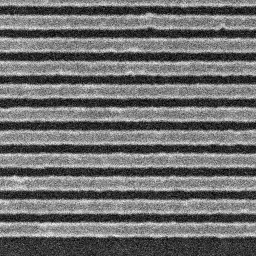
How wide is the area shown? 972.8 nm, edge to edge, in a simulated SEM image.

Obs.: parallel lines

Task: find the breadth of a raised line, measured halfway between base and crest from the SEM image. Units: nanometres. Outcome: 44.1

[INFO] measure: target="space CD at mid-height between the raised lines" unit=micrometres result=0.0403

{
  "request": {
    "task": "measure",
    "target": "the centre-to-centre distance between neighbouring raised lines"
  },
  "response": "0.0876 microns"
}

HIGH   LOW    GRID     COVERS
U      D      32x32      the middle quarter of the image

UUUUUUUUUUUUUUUUUUUUUUUUUUUUUUUU
UUUUUUUUUUUUUUUUUUUUUUUUUUUUUUUU
DUUUUUUUUUUDUUDDDUDDDDUDUUUUUDUD
DDDDDDDDDDDDDDDDDDDDDDDDDDDDDDDD
DDDDDDDDDDDDDDDDDDDDDDDDDDDDDDDD
UUUUUUUUUUUUUUUUUUUUUDUUUUUUUUUD
UUUUUUUUUUUUUUUUUUUUUUUUUUUUUUUU
UUUUUUUUUUUUUUUUUUUUUUUUUUUUUUUU
DDDDDDDDDDDDDDDDDDDDDDDDDDDDDDDD
DDDDDDDDDDDDDDDDDDDDDDDDDDDDDDDD
DDDDDDDDDDDDDDDDDDDDDDDDDDDDDDDD
UUUUUUUUUUUUUUUUUUUUUUUUUUUUUUUU
UUUUUUUUUUUUDDUUUUUUUUUUUUUUUUUU
UUUUUUUUUUUUUUUUUUUUUUUUUUUUUUUU
DDDDDDDDDDDDDDDDDDDDDDDDDDDDDDDD
DDDDDDDDDDDDDDDDDDDDDDDDDDDDDDDD
DDDDDDDDDDDDDDDDDDDDDDDDDDDDDDDD
UUUUUUUUUUUUUUUUUUUUUUUUUUUUUUUU
UUUUUUUUUUUUUUUUUUUUUUUUUUUUUUUU
UUUUUUUUUUUUUUUUUUUUUUUUUUUUUUUU
DDDDDDDDDDDDDDDDDDDDDDDDDDDDDDDD
DDDDDDDDDDDDDDDDDDDDDDDDDDDDDDDD
DDDDDDDDDDDDDDDDDDDDDDDDDDDDDDDD
UUUUUUUUUUUUUUUUUUUUUUUUUUUUUUUU
UUUUUUUUUUUUUUUUUUUUUUUUUUUUUUUU
UUUUUUUUUUUUUUUUUUUUUUUUUUUUUUUU
DDDDDDDDDDDDDDDDDDDDDDDDDDDDDDDD
DDDDDDDDDDDDDDDDDDDDDDDDDDDDDDDD
UUUUUDDUUUDUUUUUUDUDUUUUUDUUUUUU
UUUUUUUUUUUUUUUUUUUUUUUUUUUUUUUU
UUUUUUUUUUUUUUUUUUUUUUUUUUUUUUUU
DDDDDDDUUDDDDDDDDDDDDDDDDDDDDDDU